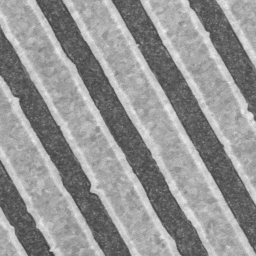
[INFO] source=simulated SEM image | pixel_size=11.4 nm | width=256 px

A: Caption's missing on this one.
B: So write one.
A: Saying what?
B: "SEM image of one or a few lines or trenches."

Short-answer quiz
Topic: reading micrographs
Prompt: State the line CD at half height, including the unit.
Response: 400 nm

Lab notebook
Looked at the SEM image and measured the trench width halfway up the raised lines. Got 0.358 micrometres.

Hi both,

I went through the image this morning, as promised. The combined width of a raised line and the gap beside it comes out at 757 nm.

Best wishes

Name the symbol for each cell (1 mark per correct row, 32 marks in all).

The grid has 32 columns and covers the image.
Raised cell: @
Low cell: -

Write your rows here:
@@@@-----@@@@@----@@@@@-----@@@@
@@@@@----@@@@@-----@@@@@----@@@@
@@@@@-----@@@@@----@@@@@-----@@@
-@@@@@----@@@@@-----@@@@@-----@@
-@@@@@-----@@@@@----@@@@@@----@@
--@@@@@----@@@@@@----@@@@@-----@
--@@@@@@----@@@@@-----@@@@@----@
---@@@@@-----@@@@@----@@@@@-----
----@@@@@----@@@@@-----@@@@@----
----@@@@@@----@@@@@----@@@@@----
-----@@@@@----@@@@@-----@@@@@---
@----@@@@@@----@@@@@-----@@@@@--
@@----@@@@@-----@@@@@----@@@@@--
@@----@@@@@@----@@@@@-----@@@@--
@@@----@@@@@-----@@@@@----@@@@@-
@@@-----@@@@@----@@@@@-----@@@@@
@@@@----@@@@@-----@@@@@----@@@@@
@@@@-----@@@@@-----@@@@-----@@@@
@@@@@----@@@@@@----@@@@@----@@@@
@@@@@@----@@@@@-----@@@@@----@@@
-@@@@@-----@@@@@----@@@@@-----@@
-@@@@@@----@@@@@-----@@@@@----@@
--@@@@@-----@@@@@----@@@@@-----@
---@@@@@----@@@@@-----@@@@@----@
---@@@@@-----@@@@@----@@@@@-----
----@@@@@----@@@@@-----@@@@@----
----@@@@@@----@@@@@----@@@@@----
-----@@@@@-----@@@@-----@@@@@---
@----@@@@@@----@@@@@-----@@@@@--
@@----@@@@@-----@@@@@----@@@@@--
@@-----@@@@@----@@@@@-----@@@@@-
@@@----@@@@@-----@@@@@----@@@@@-